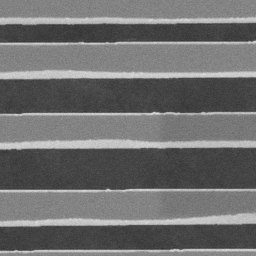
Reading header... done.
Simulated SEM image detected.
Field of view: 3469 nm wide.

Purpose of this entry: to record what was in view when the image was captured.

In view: lines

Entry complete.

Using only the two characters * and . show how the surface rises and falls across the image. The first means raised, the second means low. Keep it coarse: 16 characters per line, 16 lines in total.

****************
................
................
****************
****************
................
................
****************
****************
................
................
................
****************
****************
................
................